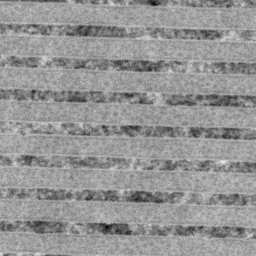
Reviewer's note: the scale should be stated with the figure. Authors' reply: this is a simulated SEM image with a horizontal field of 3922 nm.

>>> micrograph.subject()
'parallel lines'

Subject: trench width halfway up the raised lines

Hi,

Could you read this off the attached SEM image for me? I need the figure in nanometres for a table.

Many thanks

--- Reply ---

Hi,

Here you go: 193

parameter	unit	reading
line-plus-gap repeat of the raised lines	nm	503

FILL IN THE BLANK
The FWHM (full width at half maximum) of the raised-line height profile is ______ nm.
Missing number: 304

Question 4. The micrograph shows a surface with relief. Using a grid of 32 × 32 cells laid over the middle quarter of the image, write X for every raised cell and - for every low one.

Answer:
--------------------------------
XXX-XX--------------------------
XXXXXXXXXXXXXXXXXXXXXXXXXXXXXX--
XXXXXXXXXXXXXXXXXXXXXXXXXXXXXXXX
XXXXXXXXXXXXXXXXXXXXXXXXXXXXXXXX
XXXXXXXXXXXXXXXXXXXXXXXXXXXXXXXX
-----XXXXXXXXXXXXXXXXXXXXXXXXXXX
--------------------------------
--------------------------------
--------------------------------
XXXXXXXXXXXXXXXXXXXXXXXXXX------
XXXXXXXXXXXXXXXXXXXXXXXXXXXXXXXX
XXXXXXXXXXXXXXXXXXXXXXXXXXXXXXXX
XXXXXXXXXXXXXXXXXXXXXXXXXXXXXXXX
-XXXXXXXXXXXXXXXXXXXXXXXXXXXXXXX
--------------------------------
--------------------------------
--------------------------------
XXXXXXXXXXXXXX------------------
XXXXXXXXXXXXXXXXXXXXXXXXXXXXXXXX
XXXXXXXXXXXXXXXXXXXXXXXXXXXXXXXX
XXXXXXXXXXXXXXXXXXXXXXXXXXXXXXXX
XXXXXXXXXXXXXXXXXXXXXXXXXXXXXXXX
-----------------------XXXXXXXXX
--------------------------------
--------------------------------
XXXXXXXXXX----------------------
XXXXXXXXXXXXXXXXXXXXXXXXXXXXXXXX
XXXXXXXXXXXXXXXXXXXXXXXXXXXXXXXX
XXXXXXXXXXXXXXXXXXXXXXXXXXXXXXXX
XXXXXXXXXXXXXXXXXXXXXXXXXXXXXXXX
-------------------XXXXXXXXXXXXX